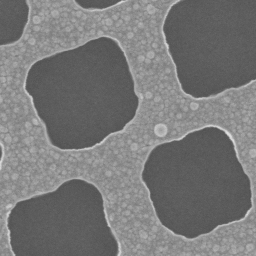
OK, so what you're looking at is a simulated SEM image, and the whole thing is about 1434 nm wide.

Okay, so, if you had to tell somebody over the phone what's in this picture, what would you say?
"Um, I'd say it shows holes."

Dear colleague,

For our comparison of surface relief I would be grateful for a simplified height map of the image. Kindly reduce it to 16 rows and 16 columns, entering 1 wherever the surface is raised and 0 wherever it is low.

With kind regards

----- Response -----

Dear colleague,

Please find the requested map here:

0011100111100000
0011111111000000
0111110111000000
1110000011100000
1100000011100000
1100000011100001
1100000001111111
1110000011111111
1110000111110011
1111111110000001
1111111110000001
1111001110000000
1100001110000000
1000000111000001
1000000111100111
1000000111111111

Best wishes